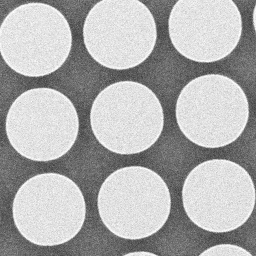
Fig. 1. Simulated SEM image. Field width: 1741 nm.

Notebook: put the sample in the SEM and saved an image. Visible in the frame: an array of small figures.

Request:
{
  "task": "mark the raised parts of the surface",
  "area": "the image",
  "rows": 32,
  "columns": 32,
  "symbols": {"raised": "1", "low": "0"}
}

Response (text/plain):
00001000000011111100001111111000
01111110000111111110011111111100
01111111000111111110011111111100
11111111100111111110011111111100
11111111100111111110011111111100
11111111100111111110001111111100
11111111100111111110001111111000
01111111000011111100000011100000
00111110000000110000000000000000
00000000000000000000000001110000
00000000000000111000000011111100
00011110000001111110000111111100
00111111100011111111001111111110
01111111100011111111001111111110
01111111110111111111001111111110
01111111110111111111001111111110
01111111110011111111000111111100
01111111100011111110000011111000
00111111100001111100000000000000
00011111000000000000000000000000
00000000000000000000000001111000
00000000000000111110000011111110
00001111100001111111000111111110
00011111110001111111100111111111
00111111110011111111100111111111
00111111111011111111100111111111
00111111111011111111100111111110
00111111110001111111100011111110
00111111110000111111000001111000
00011111100000011100000000000000
00000110000000000000000000000000
00000000000000000000000000111110